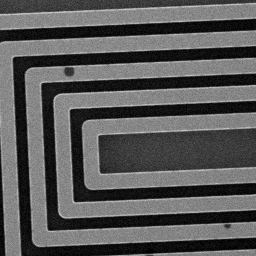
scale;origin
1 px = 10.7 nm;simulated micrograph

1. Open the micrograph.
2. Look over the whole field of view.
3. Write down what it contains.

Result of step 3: groups of lines, slits or small figures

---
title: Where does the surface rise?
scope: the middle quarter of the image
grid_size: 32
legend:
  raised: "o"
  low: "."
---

..oooooooooooooooooooooooooooooo
oooooooooooooooooooooooooooooooo
oooooooooooooooooooooooooooooooo
oooooooooooooooo................
................................
................................
.........................ooooooo
oooooooooooooooooooooooooooooooo
oooooooooooooooooooooooooooooooo
oooooooooooooooooooooooooooooooo
ooooooooooooo...................
o...............................
o...............................
o....................ooooooooooo
o....ooooooooooooooooooooooooooo
o....ooooooooooooooooooooooooooo
o....ooooooooooooooooooooooooooo
o....oooo.......................
o....ooo........................
oo...ooo........................
oo...ooo........................
oo...ooo........................
oo...ooo........................
oo...oooo.......................
oo...oooo.......................
oo...oooo.......................
oo...oooo.......................
oo...oooo.....oooooooooooooooooo
oo...ooooooooooooooooooooooooooo
oo...ooooooooooooooooooooooooooo
oo...ooooooooooooooooooooooo....
oo..............................